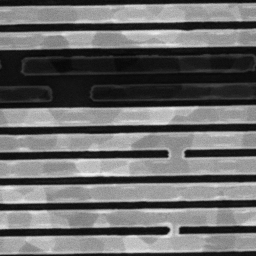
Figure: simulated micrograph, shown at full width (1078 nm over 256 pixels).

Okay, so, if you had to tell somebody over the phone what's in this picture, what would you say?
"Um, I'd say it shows parallel lines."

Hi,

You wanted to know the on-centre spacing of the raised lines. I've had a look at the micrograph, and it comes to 0.108 µm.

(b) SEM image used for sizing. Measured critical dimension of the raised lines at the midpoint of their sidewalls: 71.6 nm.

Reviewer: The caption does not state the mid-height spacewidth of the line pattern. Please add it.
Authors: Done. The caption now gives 9 pixels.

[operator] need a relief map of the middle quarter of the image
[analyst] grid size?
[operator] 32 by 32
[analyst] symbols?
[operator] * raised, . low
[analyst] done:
********************************
********************************
................................
................................
................................
.........****.******************
.......*************************
.......*************************
.......*************************
................................
................................
********************************
********************************
********************************
********************************
................................
................................
.......................*********
********************************
********************************
********************************
********..................****..
..........................****..
..........................****..
********************************
********************************
********************************
*******************************.
................................
................................
...**.**************************
********************************